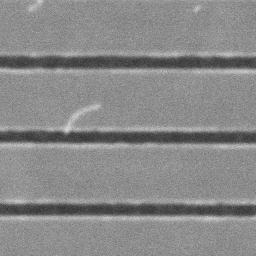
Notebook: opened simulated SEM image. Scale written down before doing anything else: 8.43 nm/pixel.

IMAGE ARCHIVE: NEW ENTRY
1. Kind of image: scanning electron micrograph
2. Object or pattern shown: lines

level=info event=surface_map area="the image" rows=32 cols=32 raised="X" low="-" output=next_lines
XXXXXXXXXXXXXXXXXXXXXXXXXXXXXXXX
XXXXXXXXXXXXXXXXXXXXXXXXXXXXXXXX
XXXXXXXXXXXXXXXXXXXXXXXXXXXXXXXX
XXXXXXXXXXXXXXXXXXXXXXXXXXXXXXXX
XXXXXXXXXXXXXXXXXXXXXXXXXXXXXXXX
XXXXXXXXXXXXXXXXXXXXXXXXXXXXXXXX
XXXXXXXXXXXXXXXXXXXXXXXXXXXXXXXX
--------------------------------
--------------------------------
XXXXXXXXXXXXXXXXXXXXXXXXXXXXXXXX
XXXXXXXXXXXXXXXXXXXXXXXXXXXXXXXX
XXXXXXXXXXXXXXXXXXXXXXXXXXXXXXXX
XXXXXXXXXXXXXXXXXXXXXXXXXXXXXXXX
XXXXXXXXXXXXXXXXXXXXXXXXXXXXXXXX
XXXXXXXXXXXXXXXXXXXXXXXXXXXXXXXX
XXXXXXXXXXXXXXXXXXXXXXXXXXXXXXXX
--------------------------------
--------------------------------
XXXXXXXXXXXXXXXXXXXXXXXXXXXXXXXX
XXXXXXXXXXXXXXXXXXXXXXXXXXXXXXXX
XXXXXXXXXXXXXXXXXXXXXXXXXXXXXXXX
XXXXXXXXXXXXXXXXXXXXXXXXXXXXXXXX
XXXXXXXXXXXXXXXXXXXXXXXXXXXXXXXX
XXXXXXXXXXXXXXXXXXXXXXXXXXXXXXXX
XXXXXXXXXXXXXXXXXXXXXXXXXXXXXXXX
--------------------------------
--------------------------------
XXXXXXXXXXXXXXXXXXXXXXXXXXXXXXXX
XXXXXXXXXXXXXXXXXXXXXXXXXXXXXXXX
XXXXXXXXXXXXXXXXXXXXXXXXXXXXXXXX
XXXXXXXXXXXXXXXXXXXXXXXXXXXXXXXX
XXXXXXXXXXXXXXXXXXXXXXXXXXXXXXXX